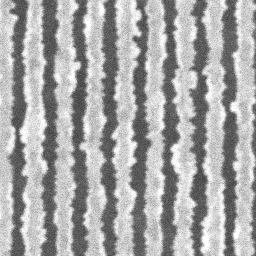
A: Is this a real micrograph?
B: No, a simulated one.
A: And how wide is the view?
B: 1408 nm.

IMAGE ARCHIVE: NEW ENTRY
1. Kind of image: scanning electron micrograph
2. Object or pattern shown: parallel lines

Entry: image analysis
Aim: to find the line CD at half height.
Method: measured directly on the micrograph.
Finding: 0.0907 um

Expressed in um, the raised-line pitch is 0.166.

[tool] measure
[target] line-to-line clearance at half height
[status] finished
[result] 0.0777 um